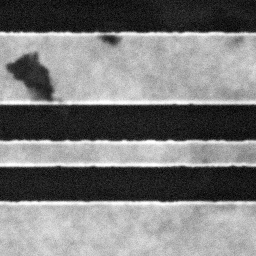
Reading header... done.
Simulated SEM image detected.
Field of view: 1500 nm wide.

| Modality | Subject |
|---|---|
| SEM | lines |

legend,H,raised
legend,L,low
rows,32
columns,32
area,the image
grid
LLLLLLLLLLLLLLLLLLLLLLLLLLLLLLLL
LLLLLLLLLLLLLLLLLLLLLLLLLLLLLLLL
LLLLLLLLLLLLLLLLLLLLLLLLLLLLLLLL
LLLLLLLLLLLLLLLLLLLLLLLLLLLLLLLL
HHHHHHHHHHHHHHHHHHHHHHHHHHHHHHHH
HHHHHHHHHHHHHHHHHHHHHHHHHHHHHHHH
HHHHHHHHHHHHHHHHHHHHHHHHHHHHHHHH
HHHHHHHHHHHHHHHHHHHHHHHHHHHHHHHH
HHHHHHHHHHHHHHHHHHHHHHHHHHHHHHHH
HHHHHHHHHHHHHHHHHHHHHHHHHHHHHHHH
HHHHHHHHHHHHHHHHHHHHHHHHHHHHHHHH
HHHHHHHHHHHHHHHHHHHHHHHHHHHHHHHH
HHHHHHHHHHHHHHHHHHHHHHHHHHHHHHHH
LLLLLLLLLLLLLLLLLLLLLLLLLLLLLLLL
LLLLLLLLLLLLLLLLLLLLLLLLLLLLLLLL
LLLLLLLLLLLLLLLLLLLLLLLLLLLLLLLL
LLLLLLLLLLLLLLLLLLLLLLLLLLLLLLLL
LLLLLLLLLLLLLLLLLLLLLLLLLLLLLLLL
HHHHHHHHHHHHHHHHHHHHHHHHHHHHHHHH
HHHHHHHHHHHHHHHHHHHHHHHHHHHHHHHH
HHHHHHHHHHHHHHHHHHHHHHHHHHHHHHHH
LLLLLLLLLLLLLLLLLLLLLLLLLLLLLLLL
LLLLLLLLLLLLLLLLLLLLLLLLLLLLLLLL
LLLLLLLLLLLLLLLLLLLLLLLLLLLLLLLL
LLLLLLLLLLLLLLLLLLLLLLLLLLLLLLLL
HHHHHHHHHHHHHHHHHHHHHHHHHHHHHHHH
HHHHHHHHHHHHHHHHHHHHHHHHHHHHHHHH
HHHHHHHHHHHHHHHHHHHHHHHHHHHHHHHH
HHHHHHHHHHHHHHHHHHHHHHHHHHHHHHHH
HHHHHHHHHHHHHHHHHHHHHHHHHHHHHHHH
HHHHHHHHHHHHHHHHHHHHHHHHHHHHHHHH
HHHHHHHHHHHHHHHHHHHHHHHHHHHHHHHH